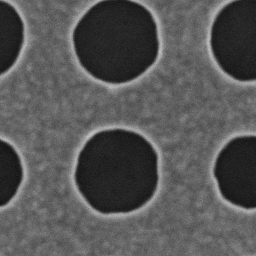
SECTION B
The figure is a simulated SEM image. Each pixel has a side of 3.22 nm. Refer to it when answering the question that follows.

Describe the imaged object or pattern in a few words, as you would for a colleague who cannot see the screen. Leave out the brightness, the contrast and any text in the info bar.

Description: holes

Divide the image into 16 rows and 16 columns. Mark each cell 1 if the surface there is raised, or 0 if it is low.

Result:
0111110001111100
0111100000111000
0111100000111000
0111100000111000
1111100001111100
1111111111111111
1111111111111111
1111111111111111
1111110001111110
0111100000111100
0111100000111000
0111100000111100
0111100001111100
1111111111111111
1111111111111111
1111111111111111